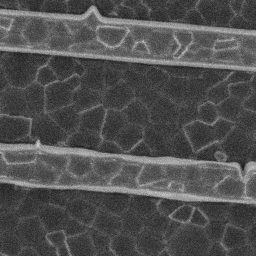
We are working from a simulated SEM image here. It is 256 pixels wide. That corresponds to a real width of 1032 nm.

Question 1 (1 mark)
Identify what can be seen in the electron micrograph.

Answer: one or a few lines or trenches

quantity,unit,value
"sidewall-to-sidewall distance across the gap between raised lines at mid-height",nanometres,388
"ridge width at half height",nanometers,153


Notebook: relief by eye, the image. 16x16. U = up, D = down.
DDDDDDDDDDDDDDDD
UUUUUUUUUUDDDDDD
UUUUUUUUUUUUUUUU
DDDDDUUUUUUUUUUU
DDDDDDDDDDDDDDDD
DDDDDDDDDDDDDDDD
DDDDDDDDDDDDDDDD
DDDDDDDDDDDDDDDD
DDDDDDDDDDDDDDDD
UUUUUUDDDDDDDDDD
UUUUUUUUUUUUUUUD
DUUUUUUUUUUUUUUU
DDDDDDDDDDDDDUUU
DDDDDDDDDDDDDDDD
DDDDDDDDDDDDDDDD
DDDDDDDDDDDDDDDD